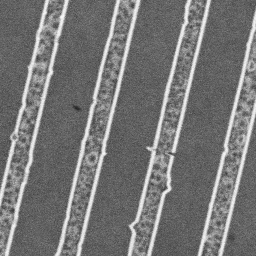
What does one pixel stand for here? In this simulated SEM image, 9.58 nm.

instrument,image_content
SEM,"one or a few lines or trenches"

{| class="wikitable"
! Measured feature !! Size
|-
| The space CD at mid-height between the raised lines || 0.466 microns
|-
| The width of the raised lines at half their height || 194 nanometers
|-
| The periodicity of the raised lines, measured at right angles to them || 0.663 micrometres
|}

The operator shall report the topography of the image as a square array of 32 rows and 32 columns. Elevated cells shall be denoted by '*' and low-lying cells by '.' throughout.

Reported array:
......**.......**......***......
.....***......***......***......
.....***......***......***......
.....***......**.......**.......
.....**.......**.......**......*
.....**......***......***......*
....***......***......***......*
....***......***......**.......*
....**.......**.......**......**
....**......***......***......**
...***......***......***......**
...***......***......**.......**
...**.......**.......**.......**
...**......***......***......***
..***......***......***......***
..***......***......***......**.
..***......**.......**.......**.
.***.......**.......**......***.
.***......***......***......***.
.***......***......**.......**..
.***......***......**.......**..
.**.......**.......**......***..
.**......***......***......***..
***......***......***......***..
***......***......**.......**...
**.......**.......**......***...
**.......**......***......***...
**......***......***......***...
**......***.....***.......**....
*.......**.......**.......**....
*.......**......***......***....
*......***......***......***....